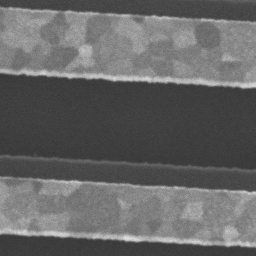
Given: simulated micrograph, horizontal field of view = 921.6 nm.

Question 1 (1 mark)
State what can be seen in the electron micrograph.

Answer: lines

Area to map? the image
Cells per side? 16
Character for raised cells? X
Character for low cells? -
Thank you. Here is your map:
XXXXXXXXXXXXXXXX
XXXXXXXXXXXXXXXX
XXXXXXXXXXXXXXXX
XXXXXXXXXXXXXXXX
XXXXXXXXXXXXXXXX
----------------
----------------
----------------
----------------
----------------
XXXXXXXXXXXXXX--
XXXXXXXXXXXXXXXX
XXXXXXXXXXXXXXXX
XXXXXXXXXXXXXXXX
XXXXXXXXXXXXXXXX
----------------